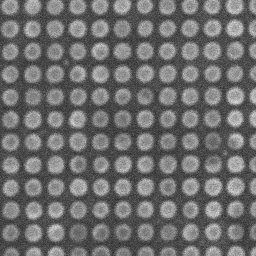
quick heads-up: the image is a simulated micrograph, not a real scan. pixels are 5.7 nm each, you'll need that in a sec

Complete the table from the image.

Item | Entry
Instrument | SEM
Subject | a regular array of raised bodies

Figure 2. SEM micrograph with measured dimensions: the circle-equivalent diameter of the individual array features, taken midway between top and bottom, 15 pixels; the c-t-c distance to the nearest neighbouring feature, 127 nm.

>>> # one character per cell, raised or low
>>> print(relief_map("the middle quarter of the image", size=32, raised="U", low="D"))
DDDDDDDDDDDDDDDDDDDDDDDDDDDDDDDD
DDUUUDDDUUUDDUUUDDDUUUDDUUUUDDUU
DDUUUDDUUUUDDUUUDDUUUUDDUUUUDDUU
DDUUUDDDUUUDDUUUDDDUUUDDUUUDDDUU
DDDDDDDDDDDDDDDDDDDDDDDDDDDDDDDD
DDDDDDDDDDDDDDDDDDDDDDDDDDDDDDDD
DDDUDDDDUUDDDDDDDDDDUDDDDUUDDDDU
DDUUUDDDUUUDDUUUDDDUUUDDUUUUDDUU
DDUUUDDDUUUDDUUUDDDUUUDDUUUUDDUU
DDUUUDDDUUDDDUUUDDDUUDDDDUUDDDUU
DDDDDDDDDDDDDDDDDDDDDDDDDDDDDDDD
DDDDDDDDDDDDDDDDDDDDDDDDDDDDDDDD
DDDUUDDDUUUDDUUUDDDUUUDDDUUDDDUU
DDUUUDDDUUUDDUUUDDUUUUDDUUUUDDUU
DDUUUDDDUUUDDUUUDDUUUUDDUUUDDDUU
DDDUDDDDDUDDDDUUDDDUUDDDDUUDDDDU
DDDDDDDDDDDDDDDDDDDDDDDDDDDDDDDD
DDDDDDDDDDDDDDDDDDDDDDDDDDDDDDDU
DDUUUDDDUUUDDUUUDDDUUUDDDUUDDDUU
DDUUUDDDUUUDDUUUUDDUUUDDUUUUDDUU
DDUUUDDDUUUDDUUUDDDUUUDDUUUDDDUU
DDDDDDDDDDDDDDDDDDDDDDDDDDDDDDDD
DDDDDDDDDDDDDDDDDDDDDDDDDDDDDDDD
DDDUDDDDDDDDDDUUDDDDUDDDDUUDDDUU
DDUUUDDDUUUDDUUUUDDUUUDDUUUUDDUU
DDUUUDDDUUUDDUUUUDDUUUDDUUUUDDUU
DDUUUDDDUUDDDUUUDDDUUUDDDUUDDDUU
DDDDDDDDDDDDDDDDDDDDDDDDDDDDDDDD
DDDDDDDDDDDDDDDDDDDDDDDDDDDDDDDD
DDUUUDDDUUDDDDUUDDDUUUDDDUUUDDUU
DDUUUDDDUUUDDUUUDDDUUUDDUUUUDDUU
DDUUUDDDUUUDDUUUUDDUUUDDUUUUDDUU